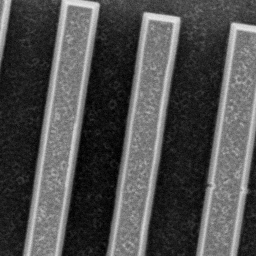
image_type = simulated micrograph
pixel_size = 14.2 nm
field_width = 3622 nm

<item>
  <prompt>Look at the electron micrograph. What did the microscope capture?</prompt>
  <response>one or a few lines or trenches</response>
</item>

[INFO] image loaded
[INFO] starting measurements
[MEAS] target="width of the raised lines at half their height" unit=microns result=0.453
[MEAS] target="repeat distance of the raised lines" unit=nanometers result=1200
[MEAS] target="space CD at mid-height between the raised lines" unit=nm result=799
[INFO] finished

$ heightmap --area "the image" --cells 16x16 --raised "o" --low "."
....oo..........
....oo...oo.....
....oo...oo....o
....oo...oo...oo
...oo....oo...oo
...oo...oo....oo
...oo...oo....oo
...oo...oo....oo
...oo...oo....oo
...oo...oo...ooo
..ooo...oo...oo.
..oo....oo...oo.
..oo...oo....oo.
..oo...oo....oo.
..oo...oo....oo.
..oo...oo....oo.